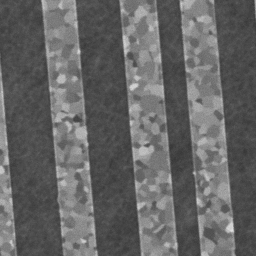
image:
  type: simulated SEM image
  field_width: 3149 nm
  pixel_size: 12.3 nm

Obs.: one or a few lines or trenches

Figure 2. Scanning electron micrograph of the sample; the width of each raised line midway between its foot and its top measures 406 nm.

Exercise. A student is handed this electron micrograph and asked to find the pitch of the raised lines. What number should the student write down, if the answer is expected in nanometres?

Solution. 846